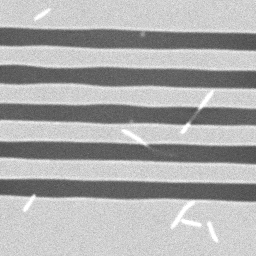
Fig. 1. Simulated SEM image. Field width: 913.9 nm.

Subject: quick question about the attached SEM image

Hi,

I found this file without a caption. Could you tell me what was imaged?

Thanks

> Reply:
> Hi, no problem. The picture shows groups of lines, slits or small figures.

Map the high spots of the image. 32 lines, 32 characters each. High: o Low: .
oooooooooooooooooooooooooooooooo
oooooooooooooooooooooooooooooooo
oooooooooooooooooooooooooooooooo
....oooooooooooooooooooooooooooo
................................
................................
oooooooooooooooooooooooooooooooo
oooooooooooooooooooooooooooooooo
................oooooooooooooooo
................................
................................
oooooooooooooooooooooooooooooooo
oooooooooooooooooooooooooooooooo
...............................o
................................
ooooooooooooo...oooo...o........
oooooooooooooooooooooooooooooooo
oooooooooooooooooooooooooooooooo
................................
................................
ooooooooooooooooooooooooooooooo.
oooooooooooooooooooooooooooooooo
...............ooooooooooooooooo
................................
oo..............................
oooooooooooooooooooooooooooooooo
oooooooooooooooooooooooooooooooo
oooooooooooooooooooooooooooooooo
oooooooooooooooooooooooooooooooo
oooooooooooooooooooooooooooooooo
oooooooooooooooooooooooooooooooo
oooooooooooooooooooooooooooooooo